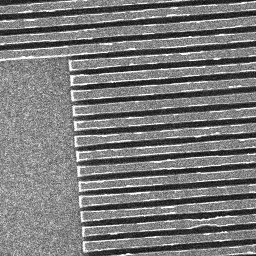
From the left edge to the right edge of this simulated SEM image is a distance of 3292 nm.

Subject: parallel lines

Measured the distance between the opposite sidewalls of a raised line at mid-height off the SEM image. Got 121 nm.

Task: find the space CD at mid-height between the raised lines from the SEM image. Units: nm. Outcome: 76.9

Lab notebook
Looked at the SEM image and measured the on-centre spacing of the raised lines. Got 194 nanometres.